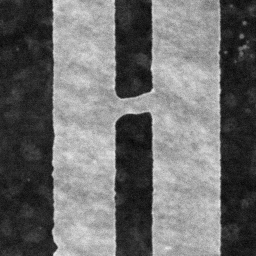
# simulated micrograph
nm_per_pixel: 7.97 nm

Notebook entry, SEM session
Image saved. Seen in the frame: one or a few lines or trenches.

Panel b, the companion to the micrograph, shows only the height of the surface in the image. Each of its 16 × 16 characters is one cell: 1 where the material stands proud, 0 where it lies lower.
0001111000111100
0001111000111100
0001111000111100
0001111001111100
0001111001111100
0001111001111100
0001111111111100
0001111000111100
0001111000111100
0001111000111100
0001111000111100
0001111000111100
0001111000111100
0001111000111100
0001111000111100
0000111000111100